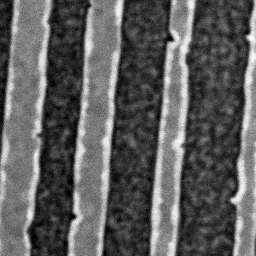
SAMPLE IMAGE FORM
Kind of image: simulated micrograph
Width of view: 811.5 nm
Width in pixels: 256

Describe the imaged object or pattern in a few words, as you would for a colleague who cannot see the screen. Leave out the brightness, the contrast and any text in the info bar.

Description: one or a few lines or trenches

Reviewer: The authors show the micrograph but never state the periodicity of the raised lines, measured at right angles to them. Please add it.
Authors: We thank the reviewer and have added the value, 75.1 pixels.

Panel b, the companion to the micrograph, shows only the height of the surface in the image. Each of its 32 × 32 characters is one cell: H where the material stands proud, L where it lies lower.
LLHHHHLLLLLHHHHLLLLLLLHHLLLLLLLL
LLHHHHLLLLLHHHHLLLLLLHHHLLLLLLLL
LLHHHHLLLLLHHHHLLLLLLHHHLLLLLLLH
LLHHHHLLLLLHHHHLLLLLLHHHLLLLLLLH
LLHHHHLLLLLHHHHLLLLLLLHHLLLLLLLH
LLHHHHLLLLLHHHHLLLLLLHHLLLLLLLLL
LHHHHHLLLLLHHHHLLLLLLHHLLLLLLLLH
LHHHHHLLLLLHHHHLLLLLLHHLLLLLLLLH
LHHHHHLLLLLHHHHLLLLLLHHLLLLLLLLH
LHHHHHLLLLLHHHHLLLLLLHHLLLLLLLLH
LHHHHHLLLLHHHHLLLLLLLHHLLLLLLLLH
LHHHHHLLLLHHHHLLLLLLLHHLLLLLLLLH
LHHHHLLLLLHHHHLLLLLLLHHLLLLLLLLH
LHHHHLLLLLHHHHLLLLLLHHHLLLLLLLLH
LHHHHLLLLLHHHHLLLLLLHHHLLLLLLLLH
LHHHHLLLLLHHHHLLLLLLHHHLLLLLLLHH
HHHHHLLLLLHHHHLLLLLLHHHLLLLLLLHH
HHHHHLLLLLHHHHLLLLLLHHHLLLLLLLHH
HHHHHLLLLLHHHHLLLLLLHHHLLLLLLLHH
HHHHHLLLLLHHHHLLLLLLHHHLLLLLLLHH
HHHHHLLLLHHHHHLLLLLLHHHLLLLLLLHH
HHHHHLLLLHHHHLLLLLLLHHLLLLLLLLHH
HHHHHLLLLHHHHLLLLLLHHHLLLLLLLLHH
HHHHLLLLLHHHHLLLLLLHHHLLLLLLLLHH
HHHHLLLLLHHHHLLLLLLHHHLLLLLLLLHH
HHHHLLLLLHHHHLLLLLLHHHLLLLLLLHHH
HHHHLLLLLHHHHLLLLLLHHHLLLLLLLLHH
HHHHLLLLLHHHHLLLLLLHHHLLLLLLLLHH
HHHLLLLLLHHHHLLLLLLHHHLLLLLLLLHH
HHHLLLLLLHHHHLLLLLLHHHLLLLLLLHHH
HHHHLLLLLHHHHLLLLLLHHHLLLLLLLHHH
HHHHLLLLLHHHHLLLLLLHHHLLLLLLLHHH